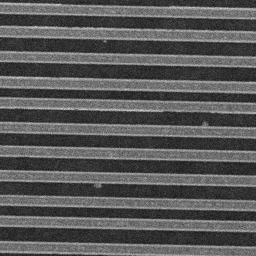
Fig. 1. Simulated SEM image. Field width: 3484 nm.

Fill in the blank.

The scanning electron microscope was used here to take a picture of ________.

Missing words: parallel lines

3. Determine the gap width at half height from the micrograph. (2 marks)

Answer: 202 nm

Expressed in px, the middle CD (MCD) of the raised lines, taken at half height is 9.63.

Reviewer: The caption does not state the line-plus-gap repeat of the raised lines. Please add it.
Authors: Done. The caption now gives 0.323 um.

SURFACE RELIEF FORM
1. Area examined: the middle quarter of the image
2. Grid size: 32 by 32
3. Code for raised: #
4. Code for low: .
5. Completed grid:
................................
................................
................................
................................
################################
################################
............................####
................................
................................
########################........
################################
.......................#########
................................
................................
................................
##################..............
################################
..........######################
................................
................................
................................
#####################...........
################################
.............###################
................................
................................
................................
###############.................
################################
.......#########################
................................
................................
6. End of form